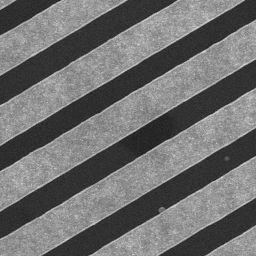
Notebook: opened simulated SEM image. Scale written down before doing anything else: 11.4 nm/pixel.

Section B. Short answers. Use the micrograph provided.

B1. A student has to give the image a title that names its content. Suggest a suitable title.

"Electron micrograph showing lines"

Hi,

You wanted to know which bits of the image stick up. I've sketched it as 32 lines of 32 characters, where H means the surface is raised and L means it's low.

HLLLLLLHHHHHHHHLLLLLLHHHHHHHHHLL
LLLLLHHHHHHHHLLLLLLLHHHHHHHHLLLL
LLLLHHHHHHHHLLLLLLHHHHHHHHLLLLLL
LLHHHHHHHHLLLLLLHHHHHHHHHLLLLLHH
HHHHHHHHLLLLLLLHHHHHHHHLLLLLLHHH
HHHHHHHLLLLLLHHHHHHHHLLLLLLHHHHH
HHHHHLLLLLLHHHHHHHHHLLLLLHHHHHHH
HHHLLLLLLLHHHHHHHHLLLLLHHHHHHHHH
HHLLLLLLHHHHHHHHLLLLLLHHHHHHHHLL
LLLLLLHHHHHHHHHLLLLLHHHHHHHHLLLL
LLLLHHHHHHHHHLLLLLHHHHHHHHHLLLLL
LLLHHHHHHHHLLLLLLHHHHHHHHLLLLLLH
LHHHHHHHHHLLLLLHHHHHHHHLLLLLLLHH
HHHHHHHHLLLLLHHHHHHHHHLLLLLLHHHH
HHHHHHLLLLLLHHHHHHHHLLLLLLHHHHHH
HHHHHLLLLLHHHHHHHHLLLLLLHHHHHHHH
HHHLLLLLHHHHHHHHHLLLLLLHHHHHHHHL
HLLLLLLHHHHHHHHLLLLLLHHHHHHHHLLL
LLLLLHHHHHHHHLLLLLLHHHHHHHHHLLLL
LLLHHHHHHHHHLLLLLLHHHHHHHHLLLLLL
LLHHHHHHHHLLLLLLHHHHHHHHLLLLLLHH
HHHHHHHHLLLLLLHHHHHHHHHLLLLLLHHH
HHHHHHHLLLLLLHHHHHHHHLLLLLLHHHHH
HHHHHLLLLLLHHHHHHHHLLLLLLHHHHHHH
HHHLLLLLLHHHHHHHHHLLLLLLHHHHHHHH
HHLLLLLLHHHHHHHHLLLLLLHHHHHHHHHL
LLLLLLHHHHHHHHLLLLLLHHHHHHHHHLLL
LLLLHHHHHHHHHLLLLLLHHHHHHHHLLLLL
LLLHHHHHHHHLLLLLLHHHHHHHHHLLLLLL
LHHHHHHHHLLLLLLHHHHHHHHHLLLLLLHH
HHHHHHHHLLLLLHHHHHHHHHLLLLLLHHHH
HHHHHHLLLLLLHHHHHHHHHLLLLLHHHHHH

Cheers